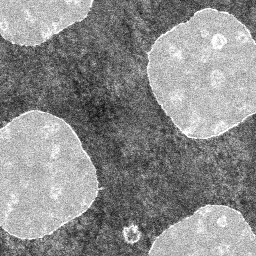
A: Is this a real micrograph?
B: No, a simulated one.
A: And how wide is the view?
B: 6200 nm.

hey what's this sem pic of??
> raised bodies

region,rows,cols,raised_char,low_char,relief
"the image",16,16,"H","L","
HHHHHHLLLLLLLLLL
HHHHHLLLLLLHHHHL
LHHLLLLLLLHHHHHH
LLLLLLLLLHHHHHHH
LLLLLLLLLHHHHHHH
LLLLLLLLLHHHHHHH
LLLLLLLLLLHHHHHH
LHHHLLLLLLLHHHHL
HHHHHLLLLLLLHLLL
HHHHHLLLLLLLLLLL
HHHHHHLLLLLLLLLL
HHHHHHLLLLLLLLLL
HHHHHHLLLLLLLLLL
HHHHHLLLLLLLHHHL
LHHLLLLLLLHHHHHH
LLLLLLLLLHHHHHHH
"